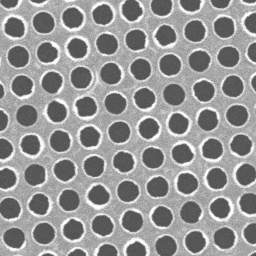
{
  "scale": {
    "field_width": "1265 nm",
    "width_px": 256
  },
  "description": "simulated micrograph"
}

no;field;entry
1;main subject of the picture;a regular array of holes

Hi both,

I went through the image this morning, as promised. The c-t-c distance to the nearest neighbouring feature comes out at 145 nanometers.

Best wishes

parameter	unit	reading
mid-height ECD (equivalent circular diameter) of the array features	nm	105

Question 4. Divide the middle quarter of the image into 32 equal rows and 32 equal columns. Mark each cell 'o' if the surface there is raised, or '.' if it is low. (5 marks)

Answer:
oooooooooo...oooo.....oo.....oo.
oo....ooo.....ooo.....oo.....ooo
oo.....oo.....ooo.....ooo...oooo
oo.....oo.....oooo...ooooooooooo
oo.....ooo....oooooooooooooooooo
oo....oooooooooooooooooooo...ooo
ooooooooooooooooooo..oooo.....oo
oooooooooooo..oooo.....oo.....oo
ooooo..ooo.....oo......oo.....oo
ooo.....oo......oo.....oo.....oo
ooo.....oo......oo....oooooooooo
.oo.....ooo....ooooooooooooooooo
.ooo...oooooo.ooooooooooooo..ooo
ooooooooooooooooooooooooooo...oo
ooooooooooooo..oooo....ooo.....o
oooooooooooo....ooo.....oo.....o
ooooo...ooo......oo.....oo.....o
.ooo.....oo.....ooo....ooooooooo
.ooo.....oo.....oooo..oooooooooo
..oo.....ooo...ooooooooooooooooo
.oooo...oooooooooooooooooooo...o
.ooooooooooooooooooo....ooo.....
ooooooooooooo...oooo.....oo.....
oooooo...ooo.....oo......oo.....
..ooo.....oo......oo.....ooo...o
...oo.....oo.....ooo....oooooooo
...oo.....oooo...ooooooooooooooo
...ooo...oooooooooooooooooooo...
..oooooooooooooooooooo...ooo....
oooooooooooooo...oooo.....oo....
oooooooo..oooo....ooo.....oo....
..ooooo....oo......oo.....ooo...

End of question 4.